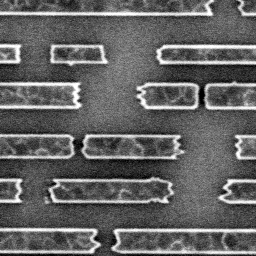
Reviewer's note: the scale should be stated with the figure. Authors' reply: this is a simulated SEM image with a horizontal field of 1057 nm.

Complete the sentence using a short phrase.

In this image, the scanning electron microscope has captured parallel lines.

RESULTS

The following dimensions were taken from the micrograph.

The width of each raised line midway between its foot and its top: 90.9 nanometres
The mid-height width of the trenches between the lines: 114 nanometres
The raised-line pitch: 194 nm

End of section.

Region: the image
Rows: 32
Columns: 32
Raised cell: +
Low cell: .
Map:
++++++++++++++++++++++++++....++
++++++++++++++++++++++++++....++
................................
................................
................................
................................
++....+++++++.......++++++++++++
++.....++++++.......++++++++++++
................................
................................
.............................+..
++++++++++........+++++++.++++++
++++++++++........+++++++.++++++
................................
................................
................................
................................
+++++++++..+++++++++++........++
+++++++++.++++++++++++........++
+++++++++..+++++++++++........++
................................
................................
..................++............
++.....++++++++++++++.......++++
++.....++++++++++++++.......++++
................................
................................
................................
................................
++++++++++++...+++++++++++++++++
++++++++++++...+++++++++++++++++
....+++++++................+.+++